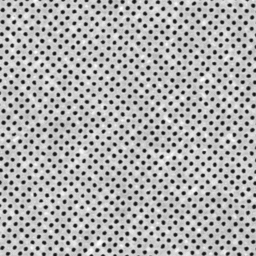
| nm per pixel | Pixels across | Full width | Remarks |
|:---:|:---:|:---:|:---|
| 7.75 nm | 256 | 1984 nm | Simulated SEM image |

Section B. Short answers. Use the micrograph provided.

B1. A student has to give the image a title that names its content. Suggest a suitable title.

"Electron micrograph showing a regular array of holes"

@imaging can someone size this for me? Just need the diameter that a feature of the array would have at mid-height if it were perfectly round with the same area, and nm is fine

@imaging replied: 33.9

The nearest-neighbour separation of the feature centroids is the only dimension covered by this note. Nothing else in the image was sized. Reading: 61.2 nm